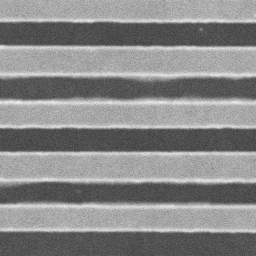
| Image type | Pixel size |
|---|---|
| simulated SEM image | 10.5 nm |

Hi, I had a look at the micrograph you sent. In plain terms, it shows lines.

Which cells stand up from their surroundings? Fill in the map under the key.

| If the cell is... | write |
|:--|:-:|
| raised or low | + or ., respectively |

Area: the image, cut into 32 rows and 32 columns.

++++++++++++++++++++++++++++++++
++++++++++++++++++++++++++++++++
++++++++++++++++++++++++++++++++
................................
................................
................................
++++++++++++++++++++++++++++++++
++++++++++++++++++++++++++++++++
++++++++++++++++++++++++++++++++
....................++..........
................................
................................
................................
++++++++++++++++++++++++++++++++
++++++++++++++++++++++++++++++++
++++++++++++++++++++++++++++++++
................................
................................
................................
++++++++++++++++++++++++++++++++
++++++++++++++++++++++++++++++++
++++++++++++++++++++++++++++++++
++++++++++++++++++++++++++++++++
................................
................................
................................
++++++++++++++++++++++++++++++++
++++++++++++++++++++++++++++++++
++++++++++++++++++++++++++++++++
................................
................................
................................